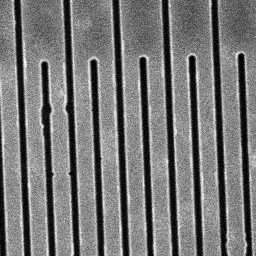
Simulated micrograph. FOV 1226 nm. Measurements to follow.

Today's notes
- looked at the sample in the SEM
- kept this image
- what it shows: parallel lines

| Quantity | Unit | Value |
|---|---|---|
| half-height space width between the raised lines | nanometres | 32.9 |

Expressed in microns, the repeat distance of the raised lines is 0.118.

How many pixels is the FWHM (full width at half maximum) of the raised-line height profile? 18.2